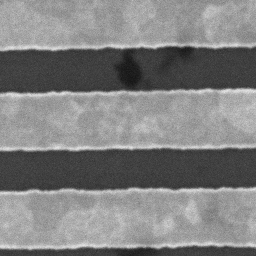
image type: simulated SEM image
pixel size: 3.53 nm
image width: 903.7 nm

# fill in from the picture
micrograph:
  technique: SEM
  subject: lines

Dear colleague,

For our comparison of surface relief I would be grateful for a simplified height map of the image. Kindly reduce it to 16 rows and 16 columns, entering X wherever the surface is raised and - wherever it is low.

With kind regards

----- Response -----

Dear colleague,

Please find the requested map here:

XXXXXXXXXXXXXXXX
XXXXXXXXXXXXXXXX
XXXXXXXXXXXXXXXX
----------------
----------------
----------------
XXXXXXXXXXXXXXXX
XXXXXXXXXXXXXXXX
XXXXXXXXXXXXXXXX
----------------
----------------
----------------
XXXXXXXXXXXXXXXX
XXXXXXXXXXXXXXXX
XXXXXXXXXXXXXXXX
XXXXX-----------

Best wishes